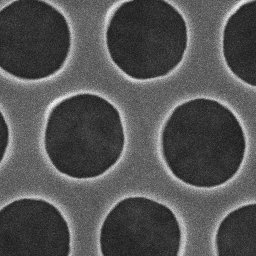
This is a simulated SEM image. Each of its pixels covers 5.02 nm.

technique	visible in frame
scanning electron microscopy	holes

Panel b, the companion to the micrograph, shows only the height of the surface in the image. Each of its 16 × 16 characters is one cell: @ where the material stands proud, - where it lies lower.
---@@@@----@@@@-
----@@@-----@@--
----@@@-----@@--
----@@@----@@@--
---@@@@@---@@@@-
@@@@@@@@@@@@@@@@
@@@@---@@@@---@@
@@@-----@@-----@
-@@-----@@-----@
@@@-----@@-----@
@@@@---@@@@----@
@@@@@@@@@@@@--@@
@-@@@@@@--@@@@@@
----@@@----@@@--
----@@-----@@@--
----@@-----@@---